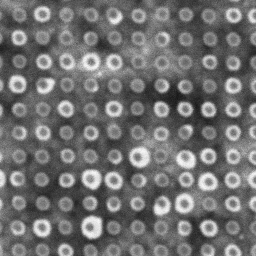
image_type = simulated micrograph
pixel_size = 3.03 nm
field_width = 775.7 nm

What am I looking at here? a regular array of raised bodies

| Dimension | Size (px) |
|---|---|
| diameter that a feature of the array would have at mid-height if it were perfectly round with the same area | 13.2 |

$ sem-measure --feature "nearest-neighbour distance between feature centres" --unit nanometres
69.9